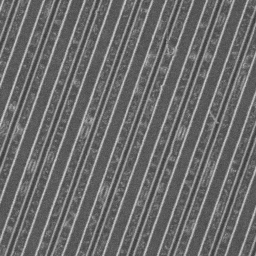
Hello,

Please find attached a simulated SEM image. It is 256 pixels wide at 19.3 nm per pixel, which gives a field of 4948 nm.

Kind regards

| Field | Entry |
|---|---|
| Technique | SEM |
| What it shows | parallel lines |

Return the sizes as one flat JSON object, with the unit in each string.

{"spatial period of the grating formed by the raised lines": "370 nm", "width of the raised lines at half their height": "0.196 µm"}